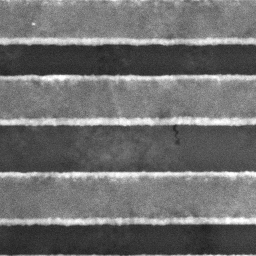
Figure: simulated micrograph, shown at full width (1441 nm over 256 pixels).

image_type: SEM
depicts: lines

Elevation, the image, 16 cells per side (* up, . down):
****************
****************
****************
................
................
****************
****************
****************
................
................
................
****************
****************
****************
................
................